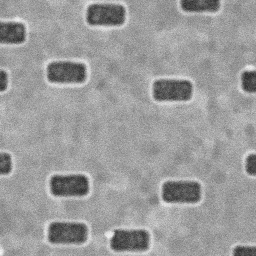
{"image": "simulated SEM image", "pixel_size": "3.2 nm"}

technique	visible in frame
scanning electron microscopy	holes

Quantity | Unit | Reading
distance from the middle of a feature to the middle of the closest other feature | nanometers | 224